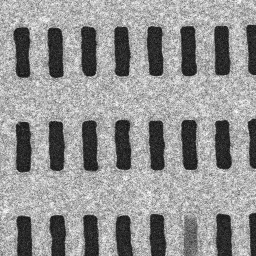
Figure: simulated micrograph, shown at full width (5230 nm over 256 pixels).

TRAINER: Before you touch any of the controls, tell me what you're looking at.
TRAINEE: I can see a regular array of holes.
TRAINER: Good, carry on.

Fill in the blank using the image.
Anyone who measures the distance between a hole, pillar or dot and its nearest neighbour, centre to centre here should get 679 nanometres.